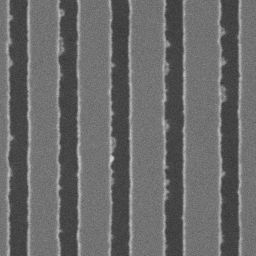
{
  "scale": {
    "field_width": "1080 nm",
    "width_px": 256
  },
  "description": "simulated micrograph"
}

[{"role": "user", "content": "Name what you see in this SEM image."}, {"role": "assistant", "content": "lines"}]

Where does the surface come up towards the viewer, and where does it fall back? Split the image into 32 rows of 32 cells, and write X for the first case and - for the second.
X--XXXX---XXXX--XXXXX--XXXXX--XX
X--XXXX---XXXX--XXXXX--XXXXX--XX
X--XXXX---XXXX--XXXXX--XXXX---XX
X--XXXX---XXXX--XXXXX--XXXXX--XX
X--XXXX---XXXX--XXXXX--XXXXX--XX
X--XXXX---XXXX--XXXXX--XXXXX--XX
X--XXXX---XXXX--XXXXX--XXXXX--XX
X--XXXX---XXXX--XXXXX--XXXXX--XX
X--XXXX---XXXX--XXXX---XXXXX--XX
X--XXXX---XXXX--XXXX---XXXXX--XX
X--XXXX---XXXX--XXXXX--XXXX---XX
X--XXXX---XXXX--XXXXX--XXXXX--XX
X--XXXX---XXXX--XXXXX--XXXXX--XX
X---XXX---XXXX--XXXX---XXXXX--XX
X--XXXX---XXXX--XXXX---XXXXX--XX
X---XXX---XXXX--XXXX---XXXXX--XX
X---XXX---XXXX--XXXXX--XXXX---XX
X---XXX---XXXX--XXXXX--XXXXX--XX
X---XXX---XXXX--XXXXX--XXXXX--XX
X--XXXX---XXXX--XXXXX--XXXXX--XX
X--XXXX---XXXX--XXXXX--XXXXX--XX
X--XXXX---XXXX--XXXXX--XXXXX--XX
X--XXXX---XXXX--XXXXX--XXXXX--XX
X---XXX---XXXX--XXXXX--XXXXX--XX
X--XXXX---XXXX--XXXXX--XXXXX--XX
X--XXXX---XXXX--XXXX---XXXXX--XX
X--XXXX---XXXX--XXXXX--XXXXX--XX
X--XXXX---XXXX--XXXXX--XXXXX--XX
X--XXXX---XXXX--XXXXX--XXXXX--XX
X--XXXX---XXXX--XXXXX--XXXXX--XX
X--XXXX---XXXX--XXXXX--XXXXX--XX
X--XXXX---XXXX--XXXXX--XXXXX--XX